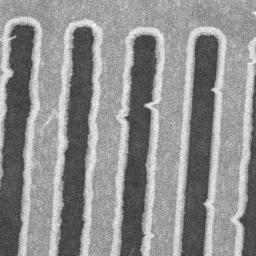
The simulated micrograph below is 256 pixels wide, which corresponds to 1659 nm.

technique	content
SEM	one or a few lines or trenches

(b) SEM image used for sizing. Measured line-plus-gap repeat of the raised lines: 61.3 px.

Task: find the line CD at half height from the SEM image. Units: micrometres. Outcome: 0.192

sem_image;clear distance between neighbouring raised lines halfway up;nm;211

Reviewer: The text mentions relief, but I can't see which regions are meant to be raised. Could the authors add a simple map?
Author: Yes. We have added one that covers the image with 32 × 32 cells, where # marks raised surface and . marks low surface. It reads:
################################
################################
##..############################
#....####...####################
#....###....####....####....####
#....###....####....####....####
#....###....####....####....###.
#....###....####....####....####
#....###....####....####....###.
#...####....####....####....###.
....####....####....####...####.
....####....####....###....####.
.....###....####....###....####.
.....###....####...####....####.
....####....###.....###....####.
....####....####...####....####.
....####....###....####....####.
....####....###....####....####.
....####....###....####....####.
....####....###....####....####.
....###....####....####....###..
...####....####....####....###..
...####....####....####....###..
...####....####....###.....###..
...####....####....###.....###..
...####....####....###....####..
...####....####....###....####..
...####....####....###....###...
...####....####...####....####..
...####....###.....###....####..
...####....###....####....####..
...####....###....####....####..